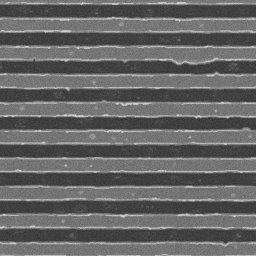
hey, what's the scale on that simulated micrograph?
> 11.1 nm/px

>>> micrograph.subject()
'parallel lines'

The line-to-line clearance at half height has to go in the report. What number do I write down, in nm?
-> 151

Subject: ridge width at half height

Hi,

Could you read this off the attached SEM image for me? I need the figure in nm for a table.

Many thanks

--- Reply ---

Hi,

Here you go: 162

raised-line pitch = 312 nanometres